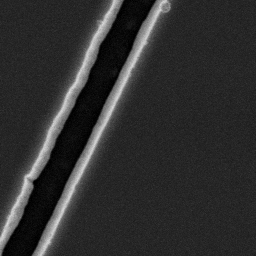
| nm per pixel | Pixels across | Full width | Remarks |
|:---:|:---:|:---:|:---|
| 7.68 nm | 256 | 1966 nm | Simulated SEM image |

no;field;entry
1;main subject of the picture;one or a few lines or trenches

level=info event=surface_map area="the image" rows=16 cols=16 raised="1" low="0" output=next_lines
1111111000111111
1111111001111111
1111110001111111
1111110011111111
1111100011111111
1111100111111111
1111000111111111
1111001111111111
1110001111111111
1110011111111111
1100011111111111
1100111111111111
1000111111111111
1000111111111111
1001111111111111
0011111111111111